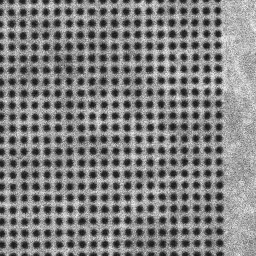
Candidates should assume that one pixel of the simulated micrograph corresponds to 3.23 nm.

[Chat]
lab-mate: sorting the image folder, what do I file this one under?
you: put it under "a regular array of holes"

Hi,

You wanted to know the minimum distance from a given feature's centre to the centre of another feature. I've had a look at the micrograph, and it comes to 36.3 nm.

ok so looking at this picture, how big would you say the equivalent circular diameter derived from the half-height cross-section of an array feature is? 0.0236 µm